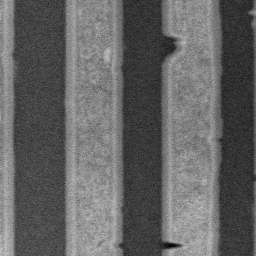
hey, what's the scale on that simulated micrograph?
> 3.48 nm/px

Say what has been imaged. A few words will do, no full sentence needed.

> one or a few lines or trenches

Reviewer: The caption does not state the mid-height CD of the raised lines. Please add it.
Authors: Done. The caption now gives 166 nm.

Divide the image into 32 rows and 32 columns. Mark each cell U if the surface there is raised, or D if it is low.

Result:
UDDDDDDDDUUUUUUDDDDDDUUUUUUDDDDD
UDDDDDDDDUUUUUUDDDDDDUUUUUUDDDDD
UDDDDDDDDUUUUUUDDDDDDUUUUUUDDDDD
UDDDDDDDDUUUUUUDDDDDDUUUUUUDDDDD
UDDDDDDDDUUUUUUDDDDDDUUUUUUDDDDD
UDDDDDDDDUUUUUUDDDDDDDUUUUUDDDDD
UDDDDDDDDUUUUUUDDDDDDDUUUUUDDDDD
UDDDDDDDDUUUUUUDDDDDDUUUUUUDDDDD
UDDDDDDDDUUUUUUDDDDDDUUUUUUDDDDD
UDDDDDDDDUUUUUUDDDDDDUUUUUUDDDDD
UDDDDDDDDUUUUUUDDDDDDUUUUUUDDDDD
UDDDDDDDDUUUUUUDDDDDDUUUUUUDDDDD
UDDDDDDDDUUUUUUDDDDDDUUUUUUDDDDD
UDDDDDDDDUUUUUUDDDDDDUUUUUUDDDDD
UDDDDDDDDUUUUUUDDDDDDUUUUUUDDDDD
UDDDDDDDDUUUUUUDDDDDDUUUUUUDDDDD
UDDDDDDDDUUUUUUDDDDDDUUUUUUDDDDD
UDDDDDDDDUUUUUUDDDDDDUUUUUUDDDDD
UDDDDDDDDUUUUUUDDDDDDUUUUUUDDDDD
UDDDDDDDDUUUUUUDDDDDDUUUUUUDDDDD
UDDDDDDDDUUUUUUDDDDDDUUUUUUDDDDD
UDDDDDDDDUUUUUUDDDDDDUUUUUUDDDDD
UDDDDDDDDUUUUUUDDDDDDUUUUUUDDDDD
UDDDDDDDDUUUUUUDDDDDDUUUUUUDDDDD
UDDDDDDDDUUUUUUDDDDDDUUUUUUDDDDD
UDDDDDDDDUUUUUUDDDDDDUUUUUUDDDDD
UDDDDDDDDUUUUUUDDDDDDUUUUUUDDDDD
UDDDDDDDDUUUUUUDDDDDDUUUUUUDDDDD
UDDDDDDDDUUUUUUDDDDDDUUUUUUDDDDD
UDDDDDDDDUUUUUUDDDDDDUUUUUUDDDDD
UDDDDDDDDUUUUUUDDDDDDDUUUUUDDDDD
UDDDDDDDDUUUUUUDDDDDDUUUUUUDDDDD